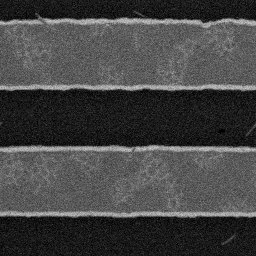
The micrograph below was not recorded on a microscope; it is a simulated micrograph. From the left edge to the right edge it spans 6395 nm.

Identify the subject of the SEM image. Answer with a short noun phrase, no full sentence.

one or a few lines or trenches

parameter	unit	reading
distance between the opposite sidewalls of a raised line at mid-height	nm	1640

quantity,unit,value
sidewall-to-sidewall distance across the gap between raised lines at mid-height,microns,1.54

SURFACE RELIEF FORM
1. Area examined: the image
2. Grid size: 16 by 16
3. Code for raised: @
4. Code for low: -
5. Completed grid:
----------------
@@@@@@@@@@@@@@@@
@@@@@@@@@@@@@@@@
@@@@@@@@@@@@@@@@
@@@@@@@@@@@@@@@@
----------------
----------------
----------------
----------------
@@@@@@@@@@@@@@@@
@@@@@@@@@@@@@@@@
@@@@@@@@@@@@@@@@
@@@@@@@@@@@@@@@@
----------------
----------------
----------------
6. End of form